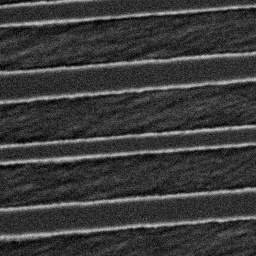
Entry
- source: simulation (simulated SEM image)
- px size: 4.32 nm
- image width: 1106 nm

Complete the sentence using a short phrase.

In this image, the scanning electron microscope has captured lines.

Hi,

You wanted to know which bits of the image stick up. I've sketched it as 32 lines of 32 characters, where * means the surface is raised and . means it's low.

..******************************
************************........
***********.....................
................................
................................
................................
................................
..................**************
.......*************************
********************************
**************************......
****************................
*****...........................
................................
................................
................................
.....................***********
.........***********************
***************************.....
*************...................
*...............................
................................
................................
................................
.....................***********
.......*************************
********************************
*****************************...
****************................
****............................
................................
................................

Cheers